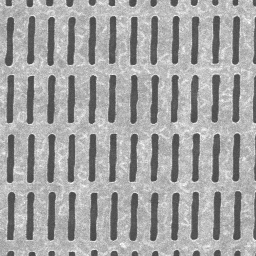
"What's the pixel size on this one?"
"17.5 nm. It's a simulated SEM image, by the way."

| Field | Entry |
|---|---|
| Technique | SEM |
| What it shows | a regular array of holes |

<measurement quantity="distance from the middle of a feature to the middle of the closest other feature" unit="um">0.352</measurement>